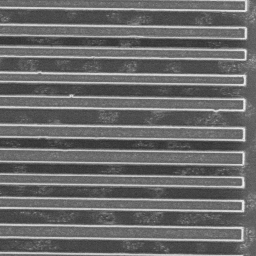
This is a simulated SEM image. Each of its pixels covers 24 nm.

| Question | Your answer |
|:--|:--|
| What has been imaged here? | parallel lines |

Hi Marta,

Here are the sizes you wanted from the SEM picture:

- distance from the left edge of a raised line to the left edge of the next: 604 nm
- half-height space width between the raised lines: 14 pixels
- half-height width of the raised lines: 240 nm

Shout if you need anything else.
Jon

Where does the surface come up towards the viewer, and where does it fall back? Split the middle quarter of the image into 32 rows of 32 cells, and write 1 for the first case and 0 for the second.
00000000000000000000000000000000
00000000000000000000000000000000
00000000000000000000000000000000
11111111111111111111111111111111
11111111111111111111111111111111
00000000000000000000000000000000
00000000000000000000000000000000
00000000000000000000000000000000
11111111111111100000000000000000
11111111111111111111111111111111
11111111111111111111111111111111
00000000000000000000000000000000
00000000000000000000000000000000
00000000000000000000000000000000
00000000000000000000000000000000
00000000000000000000000000000000
11111111111111111111111111111111
11111111111111111111111111111111
00000000000000111111111111111111
00000000000000000000000000000000
00000000000000000000000000000000
00000000000000000000000000000000
11111111111111111111111111111111
11111111111111111111111111111111
11111111111111111111111111111111
00000000000000000000000000000000
00000000000000000000000000000000
00000000000000000000000000000000
11111111111111111111111111111111
11111111111111111111111111111111
00000000000000000000000000000000
00000000000000000000000000000000